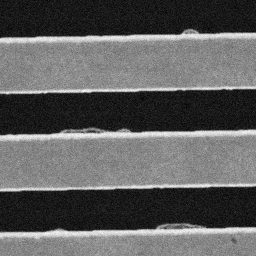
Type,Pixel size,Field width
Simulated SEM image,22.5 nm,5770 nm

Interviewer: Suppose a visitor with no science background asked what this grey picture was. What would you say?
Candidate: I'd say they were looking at lines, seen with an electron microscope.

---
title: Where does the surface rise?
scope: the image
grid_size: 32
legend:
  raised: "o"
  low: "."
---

................................
................................
................................
................................
.....................ooooooooooo
oooooooooooooooooooooooooooooooo
oooooooooooooooooooooooooooooooo
oooooooooooooooooooooooooooooooo
oooooooooooooooooooooooooooooooo
oooooooooooooooooooooooooooooooo
oooooooooooooooooooooooooooooooo
ooooooooo.......................
................................
................................
................................
................................
...........................ooooo
oooooooooooooooooooooooooooooooo
oooooooooooooooooooooooooooooooo
oooooooooooooooooooooooooooooooo
oooooooooooooooooooooooooooooooo
oooooooooooooooooooooooooooooooo
oooooooooooooooooooooooooooooooo
ooooooooooooo...................
................................
................................
................................
................................
................................
oooooooooooooooooooooooooooooooo
oooooooooooooooooooooooooooooooo
oooooooooooooooooooooooooooooooo